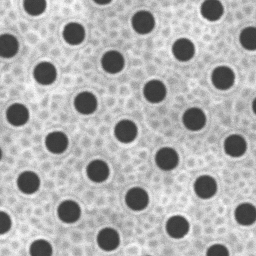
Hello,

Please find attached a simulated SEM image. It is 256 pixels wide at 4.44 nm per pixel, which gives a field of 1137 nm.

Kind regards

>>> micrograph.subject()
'a regular array of holes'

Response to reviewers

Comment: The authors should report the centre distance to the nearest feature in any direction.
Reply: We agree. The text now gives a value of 214 nm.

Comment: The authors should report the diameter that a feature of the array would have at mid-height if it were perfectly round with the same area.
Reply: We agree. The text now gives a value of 0.103 microns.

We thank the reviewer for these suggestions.